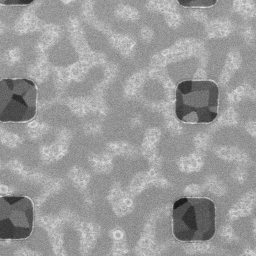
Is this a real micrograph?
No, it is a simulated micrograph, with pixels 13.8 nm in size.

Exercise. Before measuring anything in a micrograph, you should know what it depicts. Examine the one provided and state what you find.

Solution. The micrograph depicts raised bodies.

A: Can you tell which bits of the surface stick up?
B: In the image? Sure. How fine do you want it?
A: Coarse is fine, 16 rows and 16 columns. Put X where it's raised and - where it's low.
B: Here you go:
----------------
----------------
----------------
----------------
----------------
XX---------XXX--
XX---------XXX--
XX---------XX---
----------------
----------------
----------------
----------------
XX---------XX---
XX---------XX---
XX---------XX---
----------------